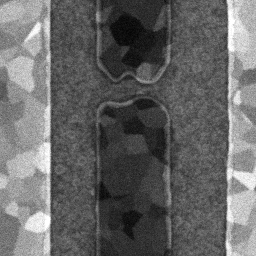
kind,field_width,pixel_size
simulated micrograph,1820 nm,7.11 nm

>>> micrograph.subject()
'one or a few lines or trenches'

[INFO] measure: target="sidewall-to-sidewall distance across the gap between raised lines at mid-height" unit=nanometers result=408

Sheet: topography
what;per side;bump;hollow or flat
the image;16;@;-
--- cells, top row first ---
@@@---@@@@@---@@
@@@---@@@@@---@@
@@@---@@@@@---@@
@@@---@@@@@---@@
@@@----@@@----@@
@@@-----------@@
@@@----@@@----@@
@@@---@@@@@---@@
@@@---@@@@@---@@
@@@---@@@@@---@@
@@@---@@@@@---@@
@@@---@@@@@---@@
@@@---@@@@@---@@
@@@---@@@@@---@@
@@@---@@@@@---@@
@@@---@@@@@---@@